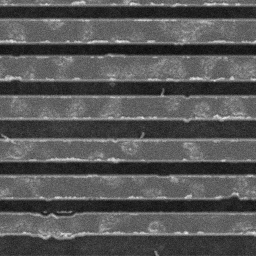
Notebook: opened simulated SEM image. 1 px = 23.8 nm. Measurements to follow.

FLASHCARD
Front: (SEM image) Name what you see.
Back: parallel lines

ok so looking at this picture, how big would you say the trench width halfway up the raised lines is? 339 nm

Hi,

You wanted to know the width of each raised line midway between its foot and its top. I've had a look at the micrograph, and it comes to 565 nanometres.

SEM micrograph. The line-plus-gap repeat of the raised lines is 918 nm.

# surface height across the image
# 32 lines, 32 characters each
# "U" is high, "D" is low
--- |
UUUUUUUUUUUUUUUUUUUUUUUUUUUUUUUU
DDDDDDDDDDDDDDDDDDDDDDDDDDDDDDDD
DDDDDDDDDDDDDDDDDDDDDDDDDDDDDDDD
UUUUUUUUUUUUUUUUUUUUUUUUUUUUUUUU
UUUUUUUUUUUUUUUUUUUUUUUUUUUUUUUU
DDDDDDDDDDDDDDDDDDDDDDDDDDDDDDDD
DDDDDDDDDDDDDDDDDDDDDDDDDDDDDDDD
UUUUUUUUUUUUUUUUUUUUUUUUUUUUUUUU
UUUUUUUUUUUUUUUUUUUUUUUUUUUUUUUU
UUUUUUUUUUUUUUUUUUUUUUUUUUUUUUUU
DDDDDDDDDDDDDDDDDDDDDDDDDDDDDDDD
DDDDDDDDDDDDDDDDDDDDDDDDDDDDDDDD
UUUUUUUUUUUUUUUUUUUUUUUUUUUUUUUU
UUUUUUUUUUUUUUUUUUUUUUUUUUUUUUUU
UUUUUUUUUUUUUUUUUUUUUUUUUUUUUUUU
DDDDDDDDDDDDDDDDDDDDDDDDDDDDDDDD
DDDDDDDDDDDDDDDDDDDDDDDDDDDDDDDD
UUDDDDDDDDDDDDDDDDDDDDDDDDDDDDDD
UUUUUUUUUUUUUUUUUUUUUUUUUUUUUUUU
UUUUUUUUUUUUUUUUUUUUUUUUUUUUUUUU
DDDDDDDDDDDDDDDDDDDDDDDDDDDDDDDD
DDDDDDDDDDDDDDDDDDDDDDDDDDDDDDDD
UUUUUUUUUUUUUUUUUUUUUUUUUUUUUUUU
UUUUUUUUUUUUUUUUUUUUUUUUUUUUUUUU
UUUUUUUUUUUUUUUUUUUUUUUUUUUUUUUU
DDDDDDDDDDDDDDDDDDDDDDDDDDDDDDDD
DDDDDDDDDDDDDDDDDDDDDDDDDDDDDDDD
UUUUUUUUUUUUUUUUUUUUUUUUUUUUUUUU
UUUUUUUUUUUUUUUUUUUUUUUUUUUUUUUU
DDDDUUUUUUDDDDDDDDDDDDDDDDDDDDDD
DDDDDDDDDDDDDDDDDDDDDDDDDDDDDDDD
DDDDDDDDDDDDDDDDDDDDDDDDDDDDDDDD